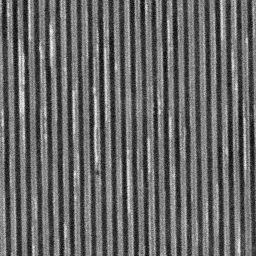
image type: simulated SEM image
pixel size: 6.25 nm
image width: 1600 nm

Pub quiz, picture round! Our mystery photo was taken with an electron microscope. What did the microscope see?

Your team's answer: parallel lines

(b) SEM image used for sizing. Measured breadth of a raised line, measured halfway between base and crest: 29.7 nanometers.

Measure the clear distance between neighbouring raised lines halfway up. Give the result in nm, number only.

35.9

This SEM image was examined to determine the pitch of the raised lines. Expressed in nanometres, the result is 66.6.